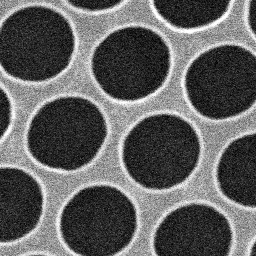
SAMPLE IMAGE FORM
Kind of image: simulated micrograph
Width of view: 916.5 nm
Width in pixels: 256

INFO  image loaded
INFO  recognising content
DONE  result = holes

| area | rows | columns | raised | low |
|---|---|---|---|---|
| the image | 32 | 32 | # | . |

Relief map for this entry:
#########......####..........##.
##.....#############........###.
#.......#############......####.
.........######...####...######.
.........####.......############
.........###.........###########
.........###.........#####.....#
.........##..........###........
........###..........###........
#......#####.........##.........
############........###.........
.############......####.........
.######....####..#######........
.####.......############.......#
.###.........######...###....###
.###.........####.......########
.##..........###.........#######
###..........##..........####...
###..........##..........###....
####........###..........###....
#####......####..........##.....
...#############........###.....
.....############......####.....
.....#####....####...######.....
.....####.......############....
.....###.........######...####..
.....###.........####......#####
.....###.........###........####
....###..........###.........###
...#####.........##..........###
########........###..........###
#########......####..........##.